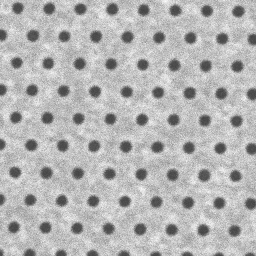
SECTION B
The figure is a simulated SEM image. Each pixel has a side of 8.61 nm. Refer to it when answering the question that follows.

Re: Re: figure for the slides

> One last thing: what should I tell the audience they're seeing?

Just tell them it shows a regular array of holes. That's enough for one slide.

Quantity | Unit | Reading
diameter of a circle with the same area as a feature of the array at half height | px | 12.1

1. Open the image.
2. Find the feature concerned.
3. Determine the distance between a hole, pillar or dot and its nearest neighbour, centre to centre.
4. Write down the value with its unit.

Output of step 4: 270 nm